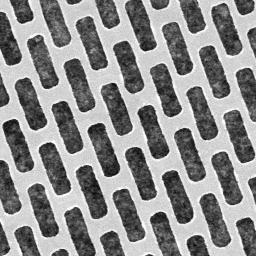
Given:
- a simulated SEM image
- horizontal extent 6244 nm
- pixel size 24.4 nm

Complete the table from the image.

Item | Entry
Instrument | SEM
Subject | a regular array of holes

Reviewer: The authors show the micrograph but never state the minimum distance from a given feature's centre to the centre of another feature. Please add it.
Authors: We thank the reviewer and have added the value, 1060 nm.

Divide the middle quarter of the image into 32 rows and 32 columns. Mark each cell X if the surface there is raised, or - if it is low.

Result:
-----XX----XXX-----XXXX---X-----
-----XX--XXXXX-----XXX----XX----
-----XXXXXXXXX-----XXX-----X---X
X-----XXXXXXXX------XX-----XXXXX
X-----XXXXXXXXX-----XX-----XXXXX
X-----XXX----XX-----XXX-----XXXX
XX-----XX-----XX----XXX-----XXX-
XX-----XX-----XXXXXXXXX-----XX--
XXX-----XX-----XXXXXXXXX-----XX-
-XX-----XX-----XXXXXXXXX-----XX-
-XX-----XX-----XXXXX--XX-----XXX
--XX---XXXX-----XXX----XX----XXX
--XXXXXXXXX-----XX-----XX----XXX
---XXXXXXXXX-----XX-----XXXXXXXX
---XXXXXXXXX-----XX-----XXXXXXXX
---XXXX---XX-----XX-----XXXXXXXX
----XX-----XX----XXX-----XXX----
----XX-----XX---XXXX-----XX-----
----XX-----XXXXXXXXX-----XX-----
-----XX-----XXXXXXXXX-----XX----
-----XX-----XXXXXXXXX-----XX----
-----XXX-----XX-----X-----XXX---
XX-XXXXX-----XX-----XX----XXX---
XXXXXXXX-----XX-----XX---XXXX---
XXXXXXXXX-----XX-----XXXXXXXXX--
XXXXX--XX-----XX-----XXXXXXXXX--
XXX----XX-----XX------XXXXXXXX--
-XX-----XX---XXXX-----XXX----XX-
-XX-----XXXXXXXXX-----XX-----XX-
--X------XXXXXXXXX-----XX----XXX
--XX-----XXXXXXXXX-----XX-----XX
--XX-----XXXX---XX-----XX-----XX